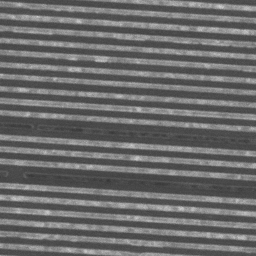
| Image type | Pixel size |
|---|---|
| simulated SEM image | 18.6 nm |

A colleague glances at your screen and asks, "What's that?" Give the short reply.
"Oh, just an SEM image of parallel lines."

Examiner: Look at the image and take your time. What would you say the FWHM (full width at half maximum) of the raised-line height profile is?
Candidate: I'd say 90.6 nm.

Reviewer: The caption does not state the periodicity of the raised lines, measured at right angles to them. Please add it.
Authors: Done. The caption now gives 225 nanometres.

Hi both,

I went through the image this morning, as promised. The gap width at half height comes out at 142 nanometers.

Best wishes